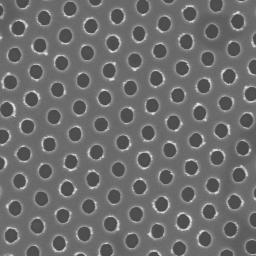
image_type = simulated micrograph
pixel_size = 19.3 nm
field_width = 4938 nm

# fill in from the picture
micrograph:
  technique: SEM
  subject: a regular array of holes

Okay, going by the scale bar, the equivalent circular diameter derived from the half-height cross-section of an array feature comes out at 268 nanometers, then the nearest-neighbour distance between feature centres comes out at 524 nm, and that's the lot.